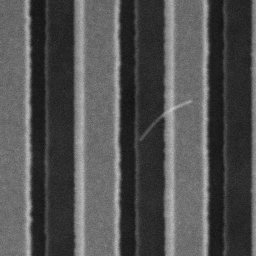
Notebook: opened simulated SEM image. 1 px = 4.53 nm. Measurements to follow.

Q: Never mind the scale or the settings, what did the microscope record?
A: lines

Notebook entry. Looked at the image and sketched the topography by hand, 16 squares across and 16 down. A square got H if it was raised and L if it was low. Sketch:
HHLLLHHLLLHHHLLL
HHLLLHHLLLHHHLLL
HHLLLHHLLLHHHLLL
HHLLLHHHLLHHHLLL
HHLLLHHLLLHHHLLL
HHLLLHHLLLHHHLLL
HHLLLHHLLLHHHLLL
HHLLLHHLLLHHHLLL
HHLLLHHLLLHHHLLL
HHLLLHHLLLHHHLLL
HHLLLHHHLLHHHLLL
HHLLLHHHLLHHHLLL
HHLLLHHLLLHHHLLL
HHLLLHHLLLHHHLLL
HHLLLHHLLLHHHLLL
HHLLLHHLLLHHHLLL